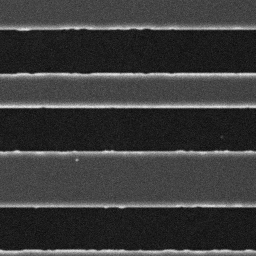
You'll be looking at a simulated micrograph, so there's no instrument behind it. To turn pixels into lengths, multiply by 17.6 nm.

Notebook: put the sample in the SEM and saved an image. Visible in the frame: lines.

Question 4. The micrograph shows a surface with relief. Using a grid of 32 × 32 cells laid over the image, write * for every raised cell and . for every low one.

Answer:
********************************
********************************
********************************
********************************
................................
................................
................................
................................
................................
********************************
********************************
********************************
********************************
................................
................................
................................
................................
................................
................................
********************************
********************************
********************************
********************************
********************************
********************************
********************************
................................
................................
................................
................................
................................
********************************